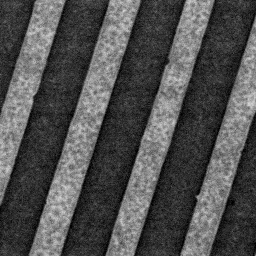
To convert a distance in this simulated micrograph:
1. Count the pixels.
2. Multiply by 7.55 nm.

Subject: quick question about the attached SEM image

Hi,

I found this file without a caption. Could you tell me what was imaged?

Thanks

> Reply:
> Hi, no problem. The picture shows one or a few lines or trenches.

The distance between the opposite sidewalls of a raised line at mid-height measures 0.209 µm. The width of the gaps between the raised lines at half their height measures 330 nm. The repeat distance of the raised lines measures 539 nm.